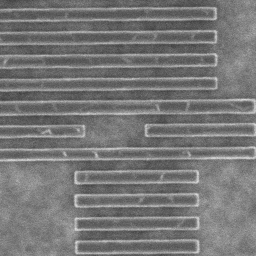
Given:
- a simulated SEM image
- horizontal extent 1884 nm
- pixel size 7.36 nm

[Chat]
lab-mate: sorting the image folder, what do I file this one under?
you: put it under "wiring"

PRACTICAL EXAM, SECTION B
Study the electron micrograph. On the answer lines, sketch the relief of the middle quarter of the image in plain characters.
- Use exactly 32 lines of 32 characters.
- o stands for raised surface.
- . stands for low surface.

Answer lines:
ooooooooooooooooooooooooooooo...
................................
................................
................................
oooooooooooooooooooooooooooooooo
oooooooooooooooooooooooooooooooo
ooooooooooooo...................
................................
................................
oooooooooooooooooooooooooooooooo
oooooooooooooooooooooooooooooooo
oooooooooooooooooooooooooooooooo
o...............................
................................
................................
ooooo................ooooooooooo
ooooo................ooooooooooo
ooooo................ooooooooooo
................................
................................
................................
oooooooooooooooooooooooooooooooo
oooooooooooooooooooooooooooooooo
oooooooooooooooooooooooooooooooo
................................
................................
................................
...ooooooooooooooooooooooooooooo
...ooooooooooooooooooooooooooooo
...ooooooooooooooooooooooooooooo
................................
................................